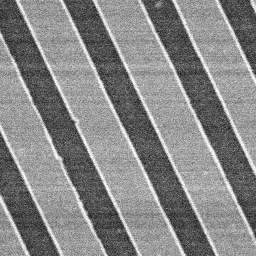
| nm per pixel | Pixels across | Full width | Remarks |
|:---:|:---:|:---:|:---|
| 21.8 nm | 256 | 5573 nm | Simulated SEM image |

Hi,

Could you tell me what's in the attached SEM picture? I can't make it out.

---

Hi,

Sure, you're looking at one or a few lines or trenches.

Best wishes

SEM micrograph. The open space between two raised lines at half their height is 662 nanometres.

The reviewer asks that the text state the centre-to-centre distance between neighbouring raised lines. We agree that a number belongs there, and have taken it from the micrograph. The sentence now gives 1530 nm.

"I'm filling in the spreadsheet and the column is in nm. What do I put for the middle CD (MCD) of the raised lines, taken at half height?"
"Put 864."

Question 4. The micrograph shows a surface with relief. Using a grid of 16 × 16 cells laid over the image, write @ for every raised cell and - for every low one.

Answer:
-@@@--@@@--@@@--
--@@@--@@---@@--
--@@@--@@@--@@@-
@--@@---@@--@@@-
@--@@@--@@@--@@@
@@--@@---@@--@@@
@@--@@@--@@@--@@
@@@--@@---@@--@@
@@@--@@@--@@@--@
-@@---@@--@@@--@
-@@@--@@@--@@@--
--@@---@@--@@@--
--@@@--@@@--@@@-
@--@@---@@--@@@-
@--@@@--@@@--@@@
@@--@@---@@--@@@